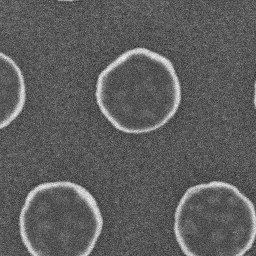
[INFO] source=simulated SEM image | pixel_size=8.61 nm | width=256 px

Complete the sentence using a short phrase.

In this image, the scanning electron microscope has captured raised bodies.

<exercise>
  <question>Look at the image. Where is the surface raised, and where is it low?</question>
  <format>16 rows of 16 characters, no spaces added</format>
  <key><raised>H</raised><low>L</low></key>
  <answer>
LLLLLLLLLLLLLLLL
LLLLLLLLLLLLLLLL
LLLLLLLLLLLLLLLL
LLLLLLLLHHLLLLLL
HLLLLLLHHHHLLLLL
HLLLLLHHHHHLLLLL
HLLLLLHHHHHLLLLL
HLLLLLLHHHLLLLLL
LLLLLLLLLLLLLLLL
LLLLLLLLLLLLLLLL
LLLLLLLLLLLLLLLL
LLLHLLLLLLLLLHLL
LLHHHHLLLLLHHHHL
LHHHHHLLLLLHHHHH
LHHHHHLLLLLHHHHH
LLHHHHLLLLLHHHHL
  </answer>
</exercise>